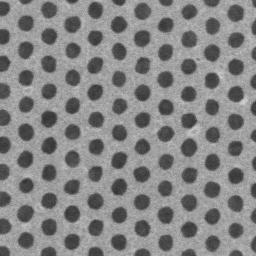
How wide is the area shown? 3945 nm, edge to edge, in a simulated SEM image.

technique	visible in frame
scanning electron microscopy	a regular array of holes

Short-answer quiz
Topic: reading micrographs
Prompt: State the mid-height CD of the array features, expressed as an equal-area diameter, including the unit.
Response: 263 nm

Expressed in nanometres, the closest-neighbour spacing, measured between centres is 408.